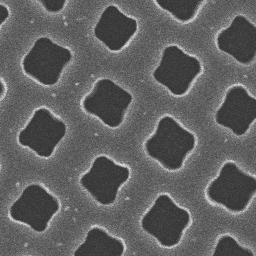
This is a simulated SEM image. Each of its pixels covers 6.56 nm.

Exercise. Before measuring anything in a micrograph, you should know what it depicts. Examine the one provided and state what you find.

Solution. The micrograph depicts a regular array of holes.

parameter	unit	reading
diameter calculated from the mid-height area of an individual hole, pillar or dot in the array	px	42.3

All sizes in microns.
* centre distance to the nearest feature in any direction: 0.483